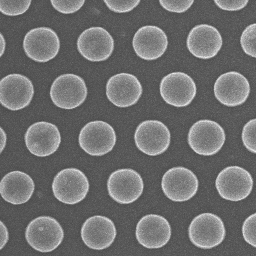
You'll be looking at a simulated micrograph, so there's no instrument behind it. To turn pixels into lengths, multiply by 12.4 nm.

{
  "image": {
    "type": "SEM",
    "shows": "a regular array of raised bodies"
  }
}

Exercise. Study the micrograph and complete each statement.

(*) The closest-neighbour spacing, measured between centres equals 53.9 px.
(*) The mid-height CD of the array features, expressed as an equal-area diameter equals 431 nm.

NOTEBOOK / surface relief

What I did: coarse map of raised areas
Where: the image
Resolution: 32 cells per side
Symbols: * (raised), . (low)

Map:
****...***...****...****...****.
***.....*.......................
................................
...........**.....**....***....*
...****...****...****...****..**
*..****...****...****..*****..**
...****...****...***....***....*
....**.....**...................
................................
.**.....**....***....***....**..
****...****..****...****...****.
****..*****..*****..****...****.
****...***....***....***...****.
.**.....*.......................
................................
....**.....**.....**....***....*
...****...****...****...****..**
*..****...****...****...****..**
....***...****...****...****...*
.....*..........................
................................
..*.....**....***....***....***.
****...****...****..*****..****.
****...****...****..*****..****.
****...****...***....***....***.
................................
................................
....***....***....***...****...*
*..*****..****...****...****..**
*..*****..****...****...****..**
*...***....***....***...***....*
................................